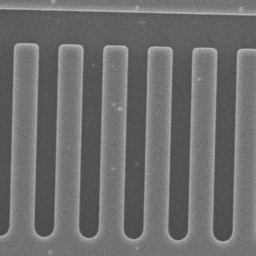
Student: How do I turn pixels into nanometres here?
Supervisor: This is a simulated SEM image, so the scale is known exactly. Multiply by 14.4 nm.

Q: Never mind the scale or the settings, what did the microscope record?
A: groups of lines, slits or small figures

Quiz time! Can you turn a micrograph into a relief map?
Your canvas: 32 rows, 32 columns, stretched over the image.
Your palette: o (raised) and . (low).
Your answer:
oooooooooooooooooooooooooooooooo
..................oooooooooooooo
................................
................................
................................
..oo............................
..ooo..ooo...ooo...ooo..ooo...oo
..ooo..ooo...ooo...ooo..ooo...oo
..ooo..ooo...ooo..oooo..ooo...oo
..ooo..ooo...ooo..ooo...ooo...oo
..ooo..ooo...ooo..ooo...ooo...oo
..ooo..ooo...ooo..ooo...ooo...oo
..ooo..ooo...ooo..ooo...ooo...oo
..ooo..ooo...ooo..ooo...ooo...oo
..ooo..ooo...ooo..ooo...ooo...oo
..ooo..ooo...ooo..ooo...ooo...oo
..oo...ooo...ooo..ooo...ooo..ooo
..oo...ooo...ooo..ooo...ooo..ooo
..oo...ooo...ooo..ooo...ooo..ooo
.ooo...ooo...ooo..ooo...ooo..ooo
.ooo...ooo...ooo..ooo...ooo..ooo
.ooo...ooo...ooo..ooo...ooo..ooo
.ooo...ooo...ooo..ooo...ooo..ooo
.ooo...ooo...ooo..ooo...ooo..ooo
.ooo...ooo...oo...ooo...ooo..ooo
.ooo...ooo...oo...ooo...ooo..ooo
.ooo...ooo...oo...ooo...ooo..ooo
.ooo...ooo...oo...ooo...ooo..ooo
.ooo...ooo..ooo...ooo...oo...ooo
ooooo.oooo..oooo.oooo..oooo..ooo
oooooooooooooooooooooooooooooooo
oooooooooooooooooooooooooooooooo